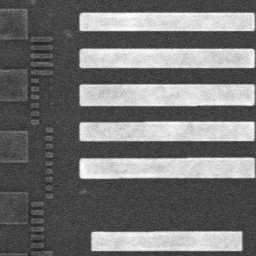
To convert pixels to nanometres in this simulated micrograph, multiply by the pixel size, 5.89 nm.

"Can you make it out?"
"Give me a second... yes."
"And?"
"wiring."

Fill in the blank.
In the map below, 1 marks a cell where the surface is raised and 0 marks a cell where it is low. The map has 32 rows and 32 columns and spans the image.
00000000000000000000000000000000
11100000000000000000000000000000
11100000001111111111111111111111
11100000001111111111111111111111
11100000000000000000000000000000
00000000000000000000000000000000
00000000001111111111111111111110
00000000001111111111111111111111
00000000000000000000000000000000
11100000000000000000000000000000
11100000000000000000000000000000
11100000001111111111111111111111
11100000001111111111111111111111
00000000000000000000000000000000
00000000000000000000000000000000
00000000001111111111111111111110
00000000001111111111111111111111
11100000001111111111111111111110
11100000000000000000000000000000
11100000000000000000000000000000
00000000001111111111111111111111
00000000001111111111111111111111
00000000000000000000000000000000
00000000000000000000000000000000
11100000000000000000000000000000
11100000000000000000000000000000
11100000000000000000000000000000
11100000000000000000000000000000
00000000000000000000000000000000
00000000000111111111111111111100
00000000000111111111111111111100
00000000000000000000000000000000